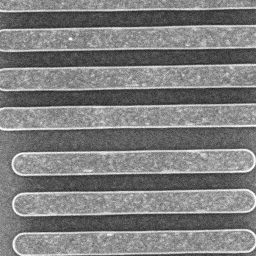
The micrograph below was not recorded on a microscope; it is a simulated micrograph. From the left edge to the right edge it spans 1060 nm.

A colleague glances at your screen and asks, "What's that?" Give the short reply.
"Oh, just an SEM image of groups of lines, slits or small figures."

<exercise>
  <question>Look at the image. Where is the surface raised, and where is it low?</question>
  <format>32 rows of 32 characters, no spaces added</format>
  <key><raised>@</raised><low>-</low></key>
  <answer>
@@@@@@@@@@@@@@@@@@@@@@@@@@@@@@@@
--------------------------------
--------------------------------
-----------------@@@@@@@@@@@@@@@
@@@@@@@@@@@@@@@@@@@@@@@@@@@@@@@@
@@@@@@@@@@@@@@@@@@@@@@@@@@@@@@@@
--------------------------------
--------------------------------
-------------@@@@@@@@@@@@@@@@@@@
@@@@@@@@@@@@@@@@@@@@@@@@@@@@@@@@
@@@@@@@@@@@@@@@@@@@@@@@@@@@@@@@@
--------------------------------
--------------------------------
@@@@@@@@@@@@@@@@@@@@@@@@@@@@@@@@
@@@@@@@@@@@@@@@@@@@@@@@@@@@@@@@@
@@@@@@@@@@@@@@@@@@@@@@@@@@@@@@@@
--------------------------------
--------------------------------
--------------------------------
--@@@@@@@@@@@@@@@@@@@@@@@@@@@@@@
--@@@@@@@@@@@@@@@@@@@@@@@@@@@@@@
--@@@@@@@@@@@@@@@@@@@@@@@@@@@---
--------------------------------
--------------------------------
--@@@@@@@@@@@@@@@@@@@@@@@@@@@@@@
--@@@@@@@@@@@@@@@@@@@@@@@@@@@@@@
--@@@@@@@@@@@@@@@@@@@@@@@-------
--------------------------------
--------------------------------
--@@@@@@@@@@@@@@@@@@@@@@@@@@@@@@
--@@@@@@@@@@@@@@@@@@@@@@@@@@@@@@
--@@@@@@@@@@@@@@@@@@@@@@@--@@---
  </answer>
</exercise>